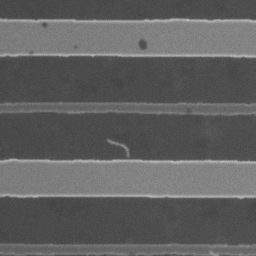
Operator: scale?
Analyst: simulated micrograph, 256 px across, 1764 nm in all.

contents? lines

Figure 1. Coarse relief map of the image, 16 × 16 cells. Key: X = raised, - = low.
----------------
XXXXXXXXXXXXXXXX
XXXXXXXXXXXXXXXX
XX-XXX-XXXXXXXXX
----------------
----------------
----------------
----------------
----------------
----------------
XXXXXXXXXXXXXXXX
XXXXXXXXXXXXXXXX
----------------
----------------
----------------
----------------